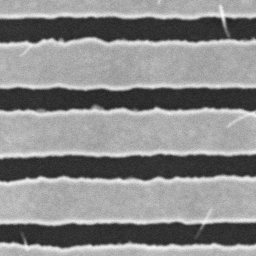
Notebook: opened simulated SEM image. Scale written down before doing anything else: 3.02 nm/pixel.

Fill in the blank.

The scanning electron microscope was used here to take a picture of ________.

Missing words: lines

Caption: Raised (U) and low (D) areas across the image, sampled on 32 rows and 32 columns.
UUUUUUUUUUUUUUUUUUUUUUUUUUUUUUUU
UUUUUUUUUUUUUUUUUUUUUUUUUUUUUUUU
DDDDDDDDDDDDDDDDDDDDDDDDDDDDDDDD
DDDDDDDDDDDDDDDDDDDDDDDDDDDDDDDD
DDDDDDDDDDDDDDDDDDDDDDDDDDDDDDDD
UUUUUUUUUUUUUUUUUUUUUUUUUUUUUUUU
UUUUUUUUUUUUUUUUUUUUUUUUUUUUUUUU
UUUUUUUUUUUUUUUUUUUUUUUUUUUUUUUU
UUUUUUUUUUUUUUUUUUUUUUUUUUUUUUUU
UUUUUUUUUUUUUUUUUUUUUUUUUUUUUUUU
UUUUUUUUUUUUUUUUUUUUUUUUUUUUUUUU
DDDDDDDDDDDDDDDDDDDDDDDDDDDDDDDD
DDDDDDDDDDDDDDDDDDDDDDDDDDDDDDDD
DDDDDDDDDDDDDDDDDDDDDDDDDDDDDDDD
UUUUUUUUUUUUUUUUUUUUUUUUUUUUUUUU
UUUUUUUUUUUUUUUUUUUUUUUUUUUUUUUU
UUUUUUUUUUUUUUUUUUUUUUUUUUUUUUUU
UUUUUUUUUUUUUUUUUUUUUUUUUUUUUUUU
UUUUUUUUUUUUUUUUUUUUUUUUUUUUUUUU
UUUUUUDUDDDUUUUUDDUDDDDDDDDDUDDD
DDDDDDDDDDDDDDDDDDDDDDDDDDDDDDDD
DDDDDDDDDDDDDDDDDDDDDDDDDDDDDDDD
DDDUUUUUUUUUUUUUUUDUUUUUUUUUUUUU
UUUUUUUUUUUUUUUUUUUUUUUUUUUUUUUU
UUUUUUUUUUUUUUUUUUUUUUUUUUUUUUUU
UUUUUUUUUUUUUUUUUUUUUUUUUUUUUUUU
UUUUUUUUUUUUUUUUUUUUUUUUUUUUUUUU
UUUUUUUUUUUUUUUUUUUUUUUUUUUUUUUU
DDDDDDDDDDDDDDDDDDDDDDDDDDDDDDDD
DDDDDDDDDDDDDDDDDDDDDDDDDDDDDDDD
UUDDDDDDDDDDDDDDUDDDDDDDDDDDDDDD
UUUUUUUUUUUUUUUUUUUUUUUUUUUUUUUU